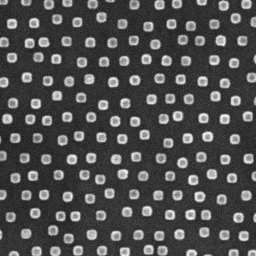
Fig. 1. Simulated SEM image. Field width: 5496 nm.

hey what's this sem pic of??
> a regular array of raised bodies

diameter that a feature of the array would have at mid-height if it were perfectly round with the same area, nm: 201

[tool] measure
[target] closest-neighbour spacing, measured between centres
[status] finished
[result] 18.8 px